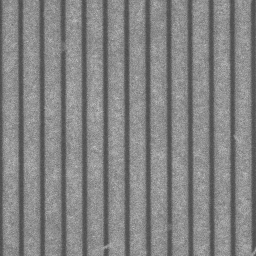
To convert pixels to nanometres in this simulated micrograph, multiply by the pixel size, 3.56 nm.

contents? parallel lines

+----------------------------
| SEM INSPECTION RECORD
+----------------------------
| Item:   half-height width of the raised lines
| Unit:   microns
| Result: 0.0569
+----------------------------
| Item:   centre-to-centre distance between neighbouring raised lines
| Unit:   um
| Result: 0.0753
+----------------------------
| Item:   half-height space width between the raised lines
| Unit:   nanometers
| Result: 17.8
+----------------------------